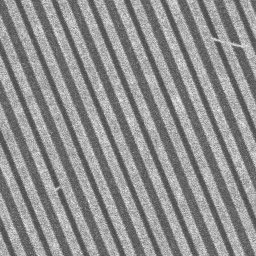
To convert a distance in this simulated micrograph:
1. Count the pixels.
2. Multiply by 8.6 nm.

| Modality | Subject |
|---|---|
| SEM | parallel lines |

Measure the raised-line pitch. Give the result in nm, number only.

145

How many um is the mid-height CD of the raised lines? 0.0765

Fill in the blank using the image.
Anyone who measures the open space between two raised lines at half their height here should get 0.0507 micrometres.